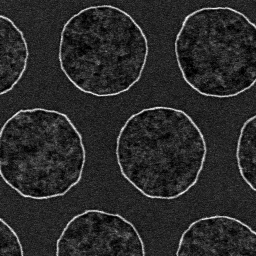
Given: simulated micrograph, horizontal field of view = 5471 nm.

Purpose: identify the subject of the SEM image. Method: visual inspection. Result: raised bodies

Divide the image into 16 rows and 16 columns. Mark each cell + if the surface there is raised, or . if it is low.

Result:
......+.........
+...++++....++++
+...+++++..+++++
++..+++++..+++++
+...+++++..+++++
+....+++....+++.
................
.+++....++++....
+++++..++++++..+
+++++..++++++..+
+++++...+++++..+
.++++...++++....
................
.....++.........
+...++++....++++
+...+++++..+++++